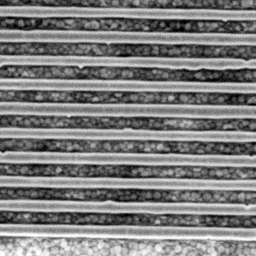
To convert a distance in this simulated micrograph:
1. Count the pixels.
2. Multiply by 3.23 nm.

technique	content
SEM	parallel lines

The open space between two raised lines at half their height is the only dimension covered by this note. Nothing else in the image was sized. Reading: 44.9 nm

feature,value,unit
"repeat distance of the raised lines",78.6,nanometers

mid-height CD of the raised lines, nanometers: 33.6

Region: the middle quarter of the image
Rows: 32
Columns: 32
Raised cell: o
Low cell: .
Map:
...oo...........oooooooooooooooo
................................
................................
................................
ooooooooooooooooooooo...........
oooooooooooooooooooooooooooooooo
ooooooooo...oooooooooooooooooooo
................................
................................
................................
oooooooooooooooooooooooooooooooo
oooooooooooooooooooooooooooooooo
oooooooooooooooooooooooooooooooo
................................
................................
................................
oooooooooooooo.ooo..............
oooooooooooooooooooooooooooooooo
oooooooooooooooooooooooooooooooo
................................
................................
................................
ooooooooooo....oo...............
oooooooooooooooooooooooooooooooo
oooooooooooooooooooooooooooooooo
................................
................................
................................
oooo..oo........................
oooooooooooooooooooooooooooooooo
oooooooooooooooooooooooooooooooo
................................